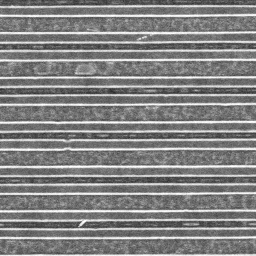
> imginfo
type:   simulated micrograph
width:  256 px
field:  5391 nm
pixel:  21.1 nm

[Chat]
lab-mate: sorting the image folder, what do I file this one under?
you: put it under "parallel lines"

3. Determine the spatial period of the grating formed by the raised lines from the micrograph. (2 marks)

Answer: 468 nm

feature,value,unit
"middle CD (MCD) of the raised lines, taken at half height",205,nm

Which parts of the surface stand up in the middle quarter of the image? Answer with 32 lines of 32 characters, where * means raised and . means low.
................................
................................
................................
.........***********************
********************************
********************************
................................
................................
********************************
********************************
................................
................................
................................
................................
................................
********************************
********************************
................................
................................
********************************
********************************
................................
................................
................................
................................
................................
********************************
********************************
................................
................................
********************************
********************************